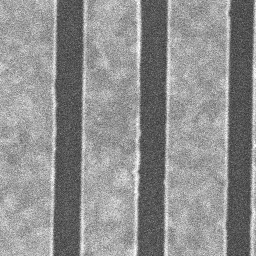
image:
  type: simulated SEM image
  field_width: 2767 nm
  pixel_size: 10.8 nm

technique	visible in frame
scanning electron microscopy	one or a few lines or trenches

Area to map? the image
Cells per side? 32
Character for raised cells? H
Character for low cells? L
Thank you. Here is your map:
HHHHHHHLLLLHHHHHHLLLLHHHHHHHHLLL
HHHHHHHLLLLHHHHHHLLLLHHHHHHHHLLL
HHHHHHHLLLLHHHHHHLLLLHHHHHHHHLLL
HHHHHHHLLLLHHHHHHLLLLHHHHHHHHLLL
HHHHHHHLLLLHHHHHHLLLLHHHHHHHHLLL
HHHHHHHLLLLHHHHHHLLLLHHHHHHHLLLL
HHHHHHHLLLLHHHHHHLLLLHHHHHHHLLLL
HHHHHHHLLLLHHHHHHLLLLHHHHHHHLLLL
HHHHHHHLLLLHHHHHHLLLLHHHHHHHLLLL
HHHHHHHLLLLHHHHHHLLLLHHHHHHHLLLL
HHHHHHHLLLHHHHHHHLLLLHHHHHHHLLLL
HHHHHHHLLLHHHHHHHLLLLHHHHHHHLLLL
HHHHHHHLLLHHHHHHHLLLLHHHHHHHLLLL
HHHHHHHLLLHHHHHHHLLLLHHHHHHHLLLL
HHHHHHHLLLHHHHHHHLLLLHHHHHHHLLLL
HHHHHHHLLLHHHHHHHLLLLHHHHHHHLLLL
HHHHHHHLLLHHHHHHHLLLLHHHHHHHLLLL
HHHHHHHLLLHHHHHHHLLLLHHHHHHHLLLL
HHHHHHHLLLHHHHHHHLLLLHHHHHHHLLLL
HHHHHHHLLLHHHHHHHLLLLHHHHHHHLLLL
HHHHHHHLLLHHHHHHHLLLLHHHHHHHLLLL
HHHHHHHLLLHHHHHHHLLLLHHHHHHHLLLL
HHHHHHHLLLHHHHHHHLLLLHHHHHHHLLLL
HHHHHHHLLLHHHHHHHLLLLHHHHHHHLLLL
HHHHHHHLLLHHHHHHHLLLLHHHHHHHLLLL
HHHHHHHLLLHHHHHHHLLLLHHHHHHHLLLL
HHHHHHHLLLHHHHHHHLLLLHHHHHHHLLLL
HHHHHHHLLLHHHHHHHLLLLHHHHHHHLLLH
HHHHHHLLLLHHHHHHHLLLLHHHHHHHLLLH
HHHHHHLLLLHHHHHHHLLLLHHHHHHHLLLH
HHHHHHLLLLHHHHHHHLLLLHHHHHHHLLLH
HHHHHHLLLLHHHHHHHLLLLHHHHHHHLLLH